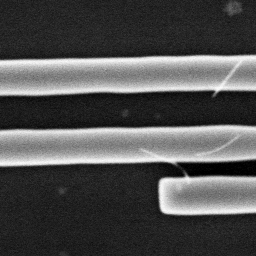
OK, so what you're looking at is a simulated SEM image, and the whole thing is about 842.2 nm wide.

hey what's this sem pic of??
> groups of lines, slits or small figures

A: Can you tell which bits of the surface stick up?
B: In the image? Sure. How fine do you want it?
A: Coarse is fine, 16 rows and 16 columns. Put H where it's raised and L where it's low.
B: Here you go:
LLLLLLLLLLLLLLLL
LLLLLLLLLLLLLLLL
LLLLLLLLLLLLLLLL
LLLLLLLLLLLLLLLL
HHHHHHHHHHHHHHHH
HHHHHHHHHHHHHHHH
LLLLLLLLLLLLLLLL
LLLLLLLLLLLLLLLL
HHHHHHHHHHHHHHHH
HHHHHHHHHHHHHHHH
LLLLLLLLLLLLLLLL
LLLLLLLLLLHHHHHH
LLLLLLLLLLHHHHHH
LLLLLLLLLLLLLLLL
LLLLLLLLLLLLLLLL
LLLLLLLLLLLLLLLL